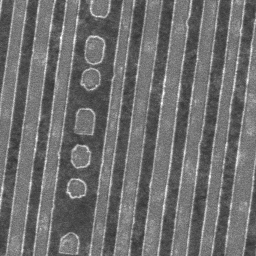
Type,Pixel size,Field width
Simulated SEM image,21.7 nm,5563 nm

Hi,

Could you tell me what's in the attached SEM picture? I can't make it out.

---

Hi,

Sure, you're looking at parallel lines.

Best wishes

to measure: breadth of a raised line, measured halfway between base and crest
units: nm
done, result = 288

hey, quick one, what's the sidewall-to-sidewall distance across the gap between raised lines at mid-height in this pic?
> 307 nm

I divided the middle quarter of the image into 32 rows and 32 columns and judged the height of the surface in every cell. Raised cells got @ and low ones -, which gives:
--@@@@@@@@@@@--@@@@---@@@@----@@
--@@@@--@@@@---@@@----@@@@----@@
--@@@----@@@@--@@@----@@@----@@@
--@@-----@@@---@@@----@@@----@@@
-@@@-----@@@---@@@----@@@----@@@
-@@@@---@@@@---@@@----@@@----@@@
-@@@@@@@@@@@---@@@----@@@----@@@
-@@@@@@@@@@@---@@@---@@@@----@@@
-@@@@@@@@@@----@@----@@@@----@@@
-@@@@@@@@@@---@@@----@@@@---@@@@
-@@@@@@@@@@---@@@----@@@----@@@@
-@@@---@@@@---@@@----@@@----@@@-
@@@-----@@@---@@@----@@@----@@@-
@@@-----@@@---@@@----@@@----@@@-
@@@-----@@@---@@@----@@@----@@@-
@@@----@@@@---@@@---@@@@----@@@-
@@@----@@@@--@@@@---@@@@----@@@-
@@@@@--@@@---@@@@---@@@----@@@@-
@@@@@@@@@@---@@@----@@@----@@@@-
@@@@@@@@@@---@@@----@@@----@@@--
@@@--@@@@@---@@@----@@@----@@@--
@@----@@@@---@@@----@@@----@@@--
@@----@@@@---@@@----@@@----@@@--
@@----@@@@---@@@----@@@----@@@--
@@----@@@@--@@@----@@@@----@@@--
@@@--@@@@---@@@----@@@-----@@@--
@@@@@@@@@---@@@----@@@----@@@---
@@@@@@@@@---@@@----@@@----@@@---
@@@@@@@@@---@@@----@@@----@@@---
@@---@@@@---@@@----@@@----@@@---
@----@@@@---@@@----@@@----@@@---
@----@@@@---@@----@@@@----@@@---